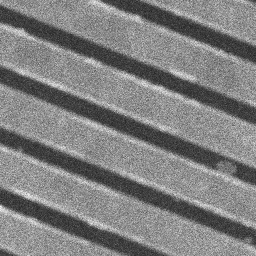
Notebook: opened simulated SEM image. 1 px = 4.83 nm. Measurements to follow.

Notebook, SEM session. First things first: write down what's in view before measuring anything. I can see parallel lines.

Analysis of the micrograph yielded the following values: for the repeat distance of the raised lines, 274 nm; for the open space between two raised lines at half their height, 91.3 nanometres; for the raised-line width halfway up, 0.182 µm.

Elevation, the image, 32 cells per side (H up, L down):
HHHHHHHHHHHHHLLLLLLHHHHHHHHHHHHH
LLLHHHHHHHHHHHHLLLLLLLHHHHHHHHHH
LLLLLHHHHHHHHHHHHHLLLLLLHHHHHHHH
HHLLLLLLHHHHHHHHHHHHLLLLLLLHHHHH
HHHHLLLLLLHHHHHHHHHHHHHLLLLLLHHH
HHHHHHLLLLLLLHHHHHHHHHHHHLLLLLLL
HHHHHHHHHLLLLLLHHHHHHHHHHHHHLLLL
HHHHHHHHHHHHLLLLLLHHHHHHHHHHHHLL
LHHHHHHHHHHHHHLLLLLLHHHHHHHHHHHH
LLLHHHHHHHHHHHHHHLLLLLHHHHHHHHHH
LLLLLLHHHHHHHHHHHHHLLLLLLHHHHHHH
HHLLLLLLLHHHHHHHHHHHHLLLLLLLHHHH
HHHHHLLLLLLHHHHHHHHHHHHHLLLLLLHH
HHHHHHHLLLLLLLHHHHHHHHHHHHLLLLLL
HHHHHHHHHLLLLLLLHHHHHHHHHHHHHLLL
HHHHHHHHHHHHLLLLLLLHHHHHHHHHHHHL
LLHHHHHHHHHHHHHLLLLLLHHHHHHHHHHH
LLLLLHHHHHHHHHHHHLLLLLLLHHHHHHHH
HLLLLLLHHHHHHHHHHHHLLLLLLLHHHHHH
HHHLLLLLLLHHHHHHHHHHHHLLLLLLLHHH
HHHHHHLLLLLLHHHHHHHHHHHHHLLLLLLH
HHHHHHHHLLLLLLLHHHHHHHHHHHHLLLLL
HHHHHHHHHHHLLLLLLHHHHHHHHHHHHHLL
LHHHHHHHHHHHHLLLLLLLHHHHHHHHHHHH
LLLHHHHHHHHHHHHHLLLLLLHHHHHHHHHH
LLLLLLHHHHHHHHHHHHLLLLLLLHHHHHHH
HHLLLLLLHHHHHHHHHHHHHLLLLLLHHHHH
HHHHLLLLLLHHHHHHHHHHHHHLLLLLLLHH
HHHHHHHLLLLLHHHHHHHHHHHHHHLLLLLL
HHHHHHHHHLLLLLLLHHHHHHHHHHHHLLLL
HHHHHHHHHHHHLLLLLLHHHHHHHHHHHHHL
LLHHHHHHHHHHHHLLLLLLLHHHHHHHHHHH